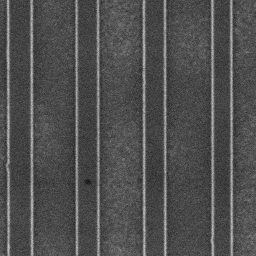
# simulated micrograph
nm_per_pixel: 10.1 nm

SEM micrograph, one or a few lines or trenches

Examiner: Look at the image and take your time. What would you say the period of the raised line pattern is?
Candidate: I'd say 680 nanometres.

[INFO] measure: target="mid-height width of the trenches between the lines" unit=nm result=456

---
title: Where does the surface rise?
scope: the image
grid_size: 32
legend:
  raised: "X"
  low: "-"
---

-XXX------XX------XXX------XX---
-XXX------XX------XXX------XX---
-XXX------XX------XXX------XX---
-XXX------XX------XXX------XX---
-XXX------XX------XXX------XX---
-XXX------XX------XXX------XX---
-XXX------XX------XXX------XX---
-XXX------XX------XXX------XX---
-XXX------XX------XXX------XX---
-XXX------XX------XXX------XX---
-XXX------XX------XXX------XX---
-XXX------XX------XXX------XX---
-XXX------XX------XXX------XX---
-XXX------XX------XXX------XX---
-XXX------XX------XXX------XX---
-XXX------XX------XXX------XX---
-XXX------XX------XXX------XX---
-XXX------XX------XXX------XX---
-XXX------XX------XXX------XX---
-XXX------XX------XXX------XX---
-XXX------XX------XXX------XX---
-XXX------XX------XXX------XX---
-XXX------XX------XXX------XX---
-XXX------XX------XXX------XX---
-XXX------XX------XXX------XX---
-XXX------XX------XXX------XX---
-XXX------XX------XXX------XX---
-XXX------XX------XXX------XX---
-XXX------XX------XXX------XX---
-XXX------XX------XXX------XX---
-XXX------XX------XXX------XX---
-XXX------XX------XXX------XX---